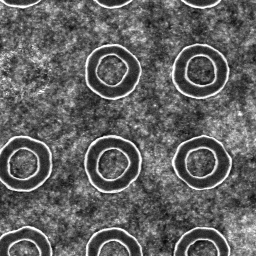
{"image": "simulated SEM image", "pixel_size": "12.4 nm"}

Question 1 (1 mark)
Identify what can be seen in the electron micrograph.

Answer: ring-shaped raised bodies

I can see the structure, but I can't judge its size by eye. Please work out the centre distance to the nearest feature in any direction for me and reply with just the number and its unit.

1100 nm